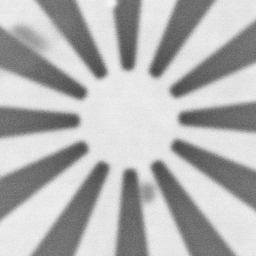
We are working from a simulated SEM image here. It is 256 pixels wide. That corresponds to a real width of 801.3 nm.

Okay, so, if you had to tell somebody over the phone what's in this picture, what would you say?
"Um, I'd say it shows groups of lines, slits or small figures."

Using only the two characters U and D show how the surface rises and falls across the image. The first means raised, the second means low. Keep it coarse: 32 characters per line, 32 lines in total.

UUUUUDDDDDUUUUDDDDUUUUDDDDDUUUUU
UUUUUDDDDDUUUUDDDDUUUDDDDDUUUUUU
UUUUUUDDDDDUUUDDDDUUUDDDDUUUUUUU
UUUUUUUDDDDUUUDDDUUUUDDDDUUUUUUD
DDUUUUUUDDDDUUUDDUUUDDDDUUUUUDDD
DDDUUUUUUDDDUUUDDUUUDDDUUUUUDDDD
DDDDDUUUUDDDUUUDDUUDDDUUUUUDDDDD
DDDDDDUUUUDDDUUDDUUDDDUUUDDDDDDD
DDDDDDDUUUUDDUUDDUUDDUUUDDDDDDDU
UUDDDDDDDUUUDUUUUUUDUUUDDDDDDUUU
UUUUUDDDDDUUUUUUUUUUUUDDDDUUUUUU
UUUUUUUDDDDUUUUUUUUUUDDDUUUUUUUU
UUUUUUUUUUUUUUUUUUUUUUUUUUUUUUUU
DDDUUUUUUUUUUUUUUUUUUUUUUUDDDDDD
DDDDDDDDDDUUUUUUUUUUUUDDDDDDDDDD
DDDDDDDDDDUUUUUUUUUUUUUDDDDDDDDD
DDDDDDUUUUUUUUUUUUUUUUUUUUUUUUDD
UUUUUUUUUUUUUUUUUUUUUUDUUUUUUUUU
UUUUUUUUDDDUUUUUUUUUUDDDDUUUUUUU
UUUUUUDDDDDUUUUUUUUUUUDDDDDDUUUU
UUUUDDDDDUUUDUUUUUUDDUUUDDDDDDUU
UDDDDDDDUUUDDDUDDUUDDUUUUDDDDDDD
DDDDDDDUUUUDDUUDDUUDDDUUUUDDDDDD
DDDDDUUUUUDDDUUDDUUUDDDUUUUUDDDD
DDDDUUUUUDDDUUUDDDUUDDDDUUUUUDDD
DDDUUUUUDDDDUUUDDDUUUDDDDUUUUUUD
DDUUUUUUDDDDUUUDDDUUUDDDDUUUUUUU
UUUUUUUDDDDUUUUDDDUUUUDDDDUUUUUU
UUUUUUDDDDDUUUUDDDUUUUDDDDDUUUUU
UUUUUDDDDDUUUUUDDDUUUUUDDDDDUUUU
UUUUUDDDDDUUUUDDDDDUUUUDDDDDUUUU
UUUUDDDDDDUUUUDDDDDUUUUDDDDDDUUU